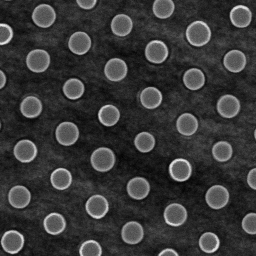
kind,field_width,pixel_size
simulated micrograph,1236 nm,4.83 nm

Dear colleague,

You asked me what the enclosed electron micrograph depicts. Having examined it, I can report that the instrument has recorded a regular array of raised bodies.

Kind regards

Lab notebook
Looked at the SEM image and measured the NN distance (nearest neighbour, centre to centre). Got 0.214 µm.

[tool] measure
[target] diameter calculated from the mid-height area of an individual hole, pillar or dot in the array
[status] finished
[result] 110 nm